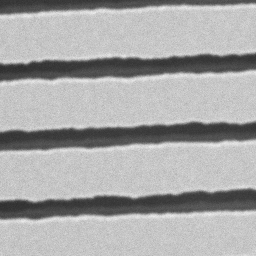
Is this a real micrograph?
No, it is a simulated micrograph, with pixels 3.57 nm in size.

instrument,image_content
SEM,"lines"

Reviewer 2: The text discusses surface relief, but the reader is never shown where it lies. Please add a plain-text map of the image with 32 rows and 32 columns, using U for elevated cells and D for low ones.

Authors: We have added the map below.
DDDDDDDDDDDDDDDDDDDDDDDDDDDDDDDD
DDDDDUUUUUUUUUUUUUUUUUUUUUUUUUUU
UUUUUUUUUUUUUUUUUUUUUUUUUUUUUUUU
UUUUUUUUUUUUUUUUUUUUUUUUUUUUUUUU
UUUUUUUUUUUUUUUUUUUUUUUUUUUUUUUU
UUUUUUUUUUUUUUUUUUUUUUUUUUUUUUUU
UUUUUUUUUUUUUUUUUUUUUUUUUUUUUUUU
UUUUUDDDUDDDDDDDDDDDDDDDDDDDDDDD
DDDDDDDDDDDDDDDDDDDDDDDDDDDDDDDD
DDDDDDDDDDDDDDDDDDUUUUUUUUUUUUUU
UUUUUUUUUUUUUUUUUUUUUUUUUUUUUUUU
UUUUUUUUUUUUUUUUUUUUUUUUUUUUUUUU
UUUUUUUUUUUUUUUUUUUUUUUUUUUUUUUU
UUUUUUUUUUUUUUUUUUUUUUUUUUUUUUUU
UUUUUUUUUUUUUUUUUUUUUUUUUUUUUUUU
UUUUUUUUUUUUUUUUUUUUUDDDDDDDDDDD
DDDDDDDDDDDDDDDDDDDDDDDDDDDDDDDD
DDDDDDDDDDDDDDDDDDDDDDDDDDDDDDDD
DDDDDDDDDDDDDUUUUUUUUUUUUUUUUUUU
UUUUUUUUUUUUUUUUUUUUUUUUUUUUUUUU
UUUUUUUUUUUUUUUUUUUUUUUUUUUUUUUU
UUUUUUUUUUUUUUUUUUUUUUUUUUUUUUUU
UUUUUUUUUUUUUUUUUUUUUUUUUUUUUUUU
UUUUUUUUUUUUUUUUUUUUUUUUUUUUUUUU
UUUUUUUUUUUUDDDDUUDDDDDDDDDDDDDD
DDDDDDDDDDDDDDDDDDDDDDDDDDDDDDDD
DDDDDDDDDDDDDDDDDDDDDDDDDDDUUUUU
UUUUUUUUUUUUUUUUUUUUUUUUUUUUUUUU
UUUUUUUUUUUUUUUUUUUUUUUUUUUUUUUU
UUUUUUUUUUUUUUUUUUUUUUUUUUUUUUUU
UUUUUUUUUUUUUUUUUUUUUUUUUUUUUUUU
UUUUUUUUUUUUUUUUUUUUUUUUUUUUUUUU